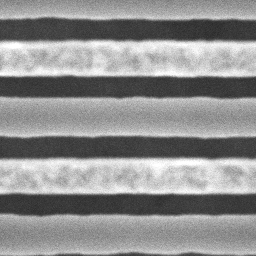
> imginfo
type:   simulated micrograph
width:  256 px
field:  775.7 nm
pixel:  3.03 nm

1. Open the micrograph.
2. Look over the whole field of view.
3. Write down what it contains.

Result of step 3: lines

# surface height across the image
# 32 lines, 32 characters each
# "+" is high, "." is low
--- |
++++++++++++++++++++++++++++++++
++++++++++++++++++++++++++++++++
................................
................................
................................
++++++++++++++++++++++++++++++++
++++++++++++++++++++++++++++++++
++++++++++++++++++++++++++++++++
++++++++++++++++++++++++++++++++
..+...................+++..+++++
................................
................................
++++++++++++++++++++++++++++++++
++++++++++++++++++++++++++++++++
++++++++++++++++++++++++++++++++
++++++++++++++++++++++++++++++++
++++++++++++++++++++++++++++++++
................................
................................
................................
++++++++++++++++++++++++++++++++
++++++++++++++++++++++++++++++++
++++++++++++++++++++++++++++++++
++++++++++++++++++++++++++++++++
................................
................................
................................
++++++++++++++++++++++++++++++++
++++++++++++++++++++++++++++++++
++++++++++++++++++++++++++++++++
++++++++++++++++++++++++++++++++
++++++++++++++++++++++++++++++++